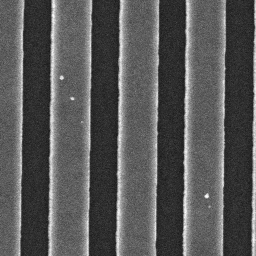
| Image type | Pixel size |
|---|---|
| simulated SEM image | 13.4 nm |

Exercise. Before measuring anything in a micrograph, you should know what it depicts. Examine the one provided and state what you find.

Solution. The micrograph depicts lines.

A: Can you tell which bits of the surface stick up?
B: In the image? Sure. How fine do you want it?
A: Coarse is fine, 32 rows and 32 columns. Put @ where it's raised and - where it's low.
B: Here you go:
@@@---@@@@@----@@@@@---@@@@@----
@@@---@@@@@----@@@@@---@@@@@----
@@@---@@@@@----@@@@@---@@@@@----
@@@---@@@@@----@@@@@---@@@@@----
@@@---@@@@@----@@@@@---@@@@@----
@@@---@@@@@----@@@@@---@@@@@----
@@@---@@@@@----@@@@@---@@@@@----
@@@---@@@@@----@@@@@---@@@@@----
@@@---@@@@@----@@@@@---@@@@@----
@@@---@@@@@----@@@@@---@@@@@----
@@@---@@@@@----@@@@@---@@@@@----
@@@---@@@@@----@@@@@---@@@@@----
@@@---@@@@@----@@@@@---@@@@@----
@@@---@@@@@----@@@@@---@@@@@----
@@@---@@@@@----@@@@@---@@@@@----
@@@---@@@@@----@@@@@---@@@@@----
@@@---@@@@@----@@@@@---@@@@@----
@@@---@@@@@----@@@@@---@@@@@----
@@@---@@@@@----@@@@@---@@@@@----
@@@---@@@@@----@@@@@---@@@@@----
@@@---@@@@@----@@@@@---@@@@@----
@@@---@@@@@----@@@@@---@@@@@----
@@@---@@@@@----@@@@@---@@@@@----
@@@---@@@@@----@@@@@---@@@@@----
@@@---@@@@@----@@@@----@@@@@----
@@@---@@@@@----@@@@----@@@@@----
@@@---@@@@@----@@@@----@@@@@----
@@@---@@@@@----@@@@----@@@@@----
@@@---@@@@@----@@@@----@@@@@----
@@@---@@@@@----@@@@----@@@@@----
@@----@@@@@----@@@@----@@@@@----
@@----@@@@@----@@@@----@@@@@----